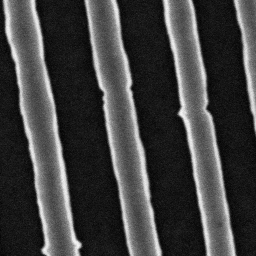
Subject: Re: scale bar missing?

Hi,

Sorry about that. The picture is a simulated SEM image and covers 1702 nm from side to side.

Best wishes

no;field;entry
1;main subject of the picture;one or a few lines or trenches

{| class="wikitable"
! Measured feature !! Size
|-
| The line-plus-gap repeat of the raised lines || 520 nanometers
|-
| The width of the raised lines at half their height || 0.185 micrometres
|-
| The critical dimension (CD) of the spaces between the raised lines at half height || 330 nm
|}